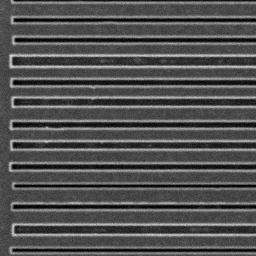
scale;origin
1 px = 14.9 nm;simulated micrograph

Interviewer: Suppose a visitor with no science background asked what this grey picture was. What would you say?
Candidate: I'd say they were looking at parallel lines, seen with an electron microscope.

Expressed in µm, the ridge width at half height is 0.209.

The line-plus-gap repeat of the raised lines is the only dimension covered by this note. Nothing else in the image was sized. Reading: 315 nm